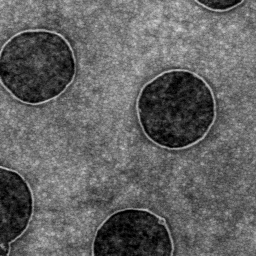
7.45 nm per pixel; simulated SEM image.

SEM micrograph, raised bodies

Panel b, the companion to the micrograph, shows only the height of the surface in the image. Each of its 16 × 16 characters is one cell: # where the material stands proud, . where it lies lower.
.............#..
................
.###............
#####...........
#####.....##....
####.....####...
.........####...
.........####...
.........####...
................
................
##..............
##..............
##.....###......
#.....#####.....
#.....#####.....